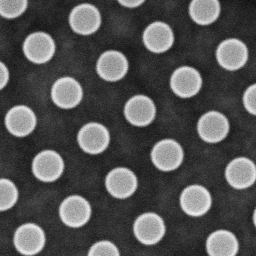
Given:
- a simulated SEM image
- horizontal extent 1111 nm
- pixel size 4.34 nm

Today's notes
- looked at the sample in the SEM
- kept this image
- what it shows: a regular array of raised bodies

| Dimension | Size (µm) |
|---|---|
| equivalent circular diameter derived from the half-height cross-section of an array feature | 0.126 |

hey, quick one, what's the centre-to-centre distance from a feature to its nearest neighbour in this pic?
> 229 nanometers